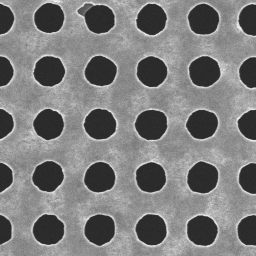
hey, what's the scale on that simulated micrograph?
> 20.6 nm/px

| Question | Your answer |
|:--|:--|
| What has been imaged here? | a regular array of holes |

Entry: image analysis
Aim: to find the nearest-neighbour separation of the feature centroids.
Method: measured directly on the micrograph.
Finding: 1050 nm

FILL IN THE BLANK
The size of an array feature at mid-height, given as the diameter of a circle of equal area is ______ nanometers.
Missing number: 641